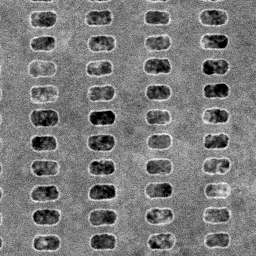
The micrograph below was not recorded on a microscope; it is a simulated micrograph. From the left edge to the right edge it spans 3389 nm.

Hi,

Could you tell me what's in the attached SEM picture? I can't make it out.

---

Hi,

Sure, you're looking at a regular array of holes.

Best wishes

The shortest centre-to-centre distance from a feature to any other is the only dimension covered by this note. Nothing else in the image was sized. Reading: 24.6 px